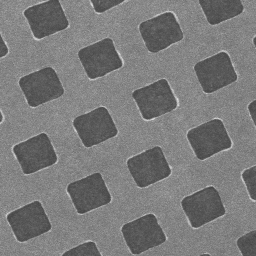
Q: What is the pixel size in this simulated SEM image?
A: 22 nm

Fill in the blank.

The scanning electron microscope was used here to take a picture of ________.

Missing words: a regular array of holes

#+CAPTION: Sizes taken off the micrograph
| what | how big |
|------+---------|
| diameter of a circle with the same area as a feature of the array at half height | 864 nanometers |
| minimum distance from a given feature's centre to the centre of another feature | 1450 nm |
